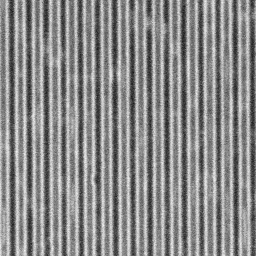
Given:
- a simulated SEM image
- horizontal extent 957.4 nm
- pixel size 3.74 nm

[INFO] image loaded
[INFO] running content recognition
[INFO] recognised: parallel lines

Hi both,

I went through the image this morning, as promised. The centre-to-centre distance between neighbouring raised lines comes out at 64.3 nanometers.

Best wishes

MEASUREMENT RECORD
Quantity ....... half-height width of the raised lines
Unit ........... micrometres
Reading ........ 0.0365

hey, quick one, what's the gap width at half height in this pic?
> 7.14 pixels